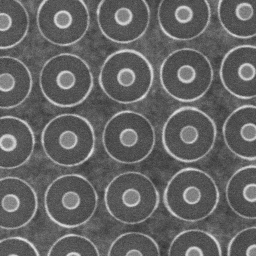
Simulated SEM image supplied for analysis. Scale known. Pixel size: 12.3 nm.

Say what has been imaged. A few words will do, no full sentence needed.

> an array of small figures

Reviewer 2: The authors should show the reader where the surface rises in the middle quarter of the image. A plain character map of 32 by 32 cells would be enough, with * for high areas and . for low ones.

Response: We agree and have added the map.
......****...........****.......
......****............**.....***
**.....**.....***.....**.....***
**.....**.....***.....**.....***
***....**.....***.....***.......
**.....***............***.......
......****...........*****......
......*****.........******......
.....*******.......*********....
....**********...***************
..******************************
*****************************...
*************.....**********....
....********........*******.....
......*****..........*****......
.......***............***.......
.......***............***.....**
***....***....****.....**....***
***....***....****.....**....***
***....***....****....***.....**
**.....***............***.......
.......****...........****......
.......****..........******.....
......******........********....
.....**********..***************
********************************
******************************..
***************...**********....
.....********........******.....
......******..........*****.....
.......****...........****......
........***.....**.....***.....*